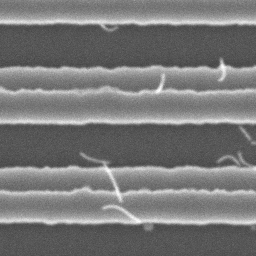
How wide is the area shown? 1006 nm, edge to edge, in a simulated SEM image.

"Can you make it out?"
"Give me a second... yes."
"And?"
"lines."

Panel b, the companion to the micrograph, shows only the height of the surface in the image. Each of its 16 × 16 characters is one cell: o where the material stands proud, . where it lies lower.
oooooooooooooooo
................
................
................
oooooooooooooooo
oooooooooooooooo
oooooooooooooooo
oooooooooooooooo
................
................
.o..o...oo.oo.o.
oooooooooooooooo
oooooooooooooooo
oooooooooooooooo
................
................